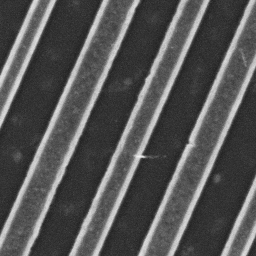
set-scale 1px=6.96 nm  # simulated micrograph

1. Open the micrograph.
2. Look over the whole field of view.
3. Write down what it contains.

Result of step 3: one or a few lines or trenches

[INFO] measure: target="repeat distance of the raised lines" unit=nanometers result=471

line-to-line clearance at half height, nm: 296